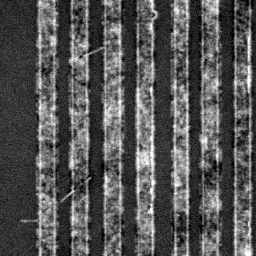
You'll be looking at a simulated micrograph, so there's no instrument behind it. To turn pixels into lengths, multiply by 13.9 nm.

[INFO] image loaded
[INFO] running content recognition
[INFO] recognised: parallel lines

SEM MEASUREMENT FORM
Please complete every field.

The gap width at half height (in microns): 0.248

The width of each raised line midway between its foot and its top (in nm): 196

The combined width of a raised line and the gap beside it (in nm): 451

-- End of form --